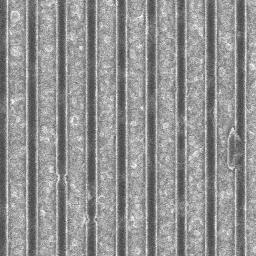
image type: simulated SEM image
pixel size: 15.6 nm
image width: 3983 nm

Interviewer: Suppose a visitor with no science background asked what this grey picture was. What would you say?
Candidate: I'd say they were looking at parallel lines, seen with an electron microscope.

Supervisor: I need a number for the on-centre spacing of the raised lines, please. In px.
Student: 29.8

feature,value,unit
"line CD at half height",175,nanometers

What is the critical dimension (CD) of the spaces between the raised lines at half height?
296 nm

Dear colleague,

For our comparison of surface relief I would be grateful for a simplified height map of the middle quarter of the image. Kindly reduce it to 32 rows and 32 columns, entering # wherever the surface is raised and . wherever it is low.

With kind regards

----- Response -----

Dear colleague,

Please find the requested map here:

#.....##.....###.....##.....##..
#.....##.....###.....##.....##..
#.....##.....###.....##.....##..
#.....##.....###.....##.....##..
#.....##.....###.....##.....##..
#.....##.....###.....##.....###.
#.....##.....###.....##.....###.
#.....##.....###.....##.....##..
#.....##.....###.....##.....##..
#.....##.....###.....##.....##..
#.....##.....###.....##.....##..
#.....##.....###.....##.....##..
#.....##.....###.....##.....##..
#.....##.....###.....##.....##..
#.....##.....###.....##.....##..
#.....##.....###.....##.....##..
#.....##.....###.....##.....##..
#.....##.....###.....##.....##..
#.....##.....###.....##.....##..
#.....##.....###.....##.....##..
#.....##.....###.....##.....##..
#.....##.....###.....##.....##..
#.....##.....###.....##.....##..
#.....##.....###.....##.....##..
#.....##.....###.....##.....##..
#.....##.....###.....##.....##..
#.....##.....###.....##.....##..
#.....##.....###.....##.....##..
......##.....###.....##.....##..
#.....##.....###.....##.....##..
#.....##.....###.....##.....##..
#.....##.....###.....##.....##..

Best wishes